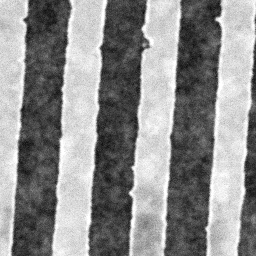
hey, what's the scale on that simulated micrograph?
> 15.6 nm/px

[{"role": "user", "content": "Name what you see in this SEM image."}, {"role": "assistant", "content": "one or a few lines or trenches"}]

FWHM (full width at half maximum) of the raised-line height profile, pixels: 32.8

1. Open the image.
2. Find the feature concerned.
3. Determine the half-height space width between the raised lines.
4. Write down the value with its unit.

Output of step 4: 0.678 microns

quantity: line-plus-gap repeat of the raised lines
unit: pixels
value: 76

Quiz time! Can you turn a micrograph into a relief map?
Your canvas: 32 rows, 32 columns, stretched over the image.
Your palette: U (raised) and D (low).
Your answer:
UUUDDDDDDUUUUDDDDDDUUUDDDDDDUUUU
UUUDDDDDDUUUUDDDDDUUUUDDDDDDUUUU
UUUDDDDDDUUUUDDDDDUUUUDDDDDUUUUU
UUUDDDDDDUUUUDDDDDUUUUDDDDDDUUUU
UUUDDDDDDUUUUDDDDDUUUUDDDDDDUUUU
UUUDDDDDDUUUUDDDDDDUUUDDDDDDUUUU
UUUDDDDDUUUUDDDDDDUUUUDDDDDDUUUU
UUUDDDDDUUUUUDDDDDUUUUDDDDDDUUUU
UUUDDDDDUUUUUDDDDDUUUUDDDDDUUUUD
UUUDDDDDUUUUDDDDDDUUUUDDDDDUUUUD
UUUDDDDDUUUUDDDDDDUUUUDDDDDUUUUD
UUUDDDDDUUUUDDDDDDUUUUDDDDDUUUUD
UUUDDDDDUUUUDDDDDDUUUUDDDDDUUUUD
UUDDDDDDUUUUDDDDDUUUUUDDDDDUUUUD
UUDDDDDDUUUUDDDDDUUUUDDDDDDUUUUD
UUDDDDDDUUUUDDDDDUUUUDDDDDDUUUUD
UUDDDDDDUUUUDDDDDUUUUDDDDDDUUUUD
UUDDDDDDUUUUDDDDDUUUUDDDDDDUUUUD
UUDDDDDDUUUUDDDDDUUUUDDDDDDUUUUD
UUDDDDDDUUUUDDDDDUUUUDDDDDDUUUUD
UUDDDDDDUUUUDDDDDUUUUDDDDDDUUUDD
UUDDDDDDUUUUDDDDDUUUUDDDDDDUUUDD
UUDDDDDUUUUDDDDDDUUUUDDDDDDUUUDD
UUDDDDDUUUUDDDDDDUUUUDDDDDUUUUDD
UUDDDDDUUUUDDDDDDUUUUDDDDDUUUUDD
UUDDDDDUUUUDDDDDDUUUUDDDDDUUUUDD
UUDDDDDUUUUDDDDDDUUUUDDDDDUUUUDD
UUDDDDDUUUUDDDDDDUUUUDDDDDUUUUDD
UDDDDDDUUUUDDDDDUUUUUDDDDDUUUUDD
UDDDDDDUUUUDDDDDUUUUUDDDDDUUUUDD
UDDDDDDUUUUDDDDDUUUUDDDDDDUUUUDD
UDDDDDDUUUUDDDDDUUUUDDDDDDUUUUDD